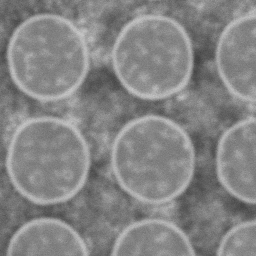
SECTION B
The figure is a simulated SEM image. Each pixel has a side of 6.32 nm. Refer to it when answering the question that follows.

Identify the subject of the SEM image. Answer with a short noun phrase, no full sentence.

raised bodies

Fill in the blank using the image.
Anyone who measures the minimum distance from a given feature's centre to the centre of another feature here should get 647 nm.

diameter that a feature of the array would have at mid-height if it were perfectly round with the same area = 515 nm